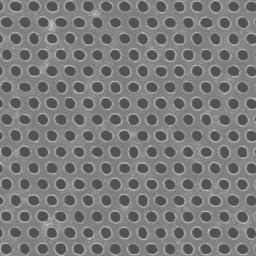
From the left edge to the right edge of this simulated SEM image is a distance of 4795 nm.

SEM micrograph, a regular array of holes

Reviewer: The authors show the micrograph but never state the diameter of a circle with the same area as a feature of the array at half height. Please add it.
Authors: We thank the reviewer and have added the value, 202 nanometers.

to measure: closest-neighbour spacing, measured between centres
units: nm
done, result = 336